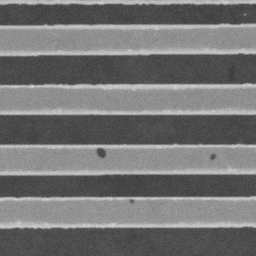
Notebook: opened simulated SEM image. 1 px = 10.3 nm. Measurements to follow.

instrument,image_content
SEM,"lines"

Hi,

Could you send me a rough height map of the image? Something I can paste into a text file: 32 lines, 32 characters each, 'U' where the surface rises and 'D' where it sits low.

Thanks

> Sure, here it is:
DDDDDDDDDDDUDDDDDDDDDDDDDDDDDDDD
DDDDDDDDDDDDDDDDDDDDDDDDDDDDDDDD
DDDDDDDDDDDDDDDDDDDDDDDDDDDDDDDD
UUUUUUUUUUUUUUUUUUUUUUUUUUUUUUUU
UUUUUUUUUUUUUUUUUUUUUUUUUUUUUUUU
UUUUUUUUUUUUUUUUUUUUUUUUUUUUUUUU
UUUUUUUUUUUUUUUUUUUUUUUUUUUUUUUU
DDDDDDDDDDDDDDDDDDDDDDDDDDDDDDDD
DDDDDDDDDDDDDDDDDDDDDDDDDDDDDDDD
DDDDDDDDDDDDDDDDDDDDDDDDDDDDDDDD
DDDDDDDDDDDDDDDDDDDDDDDDDDDDDDDD
UUUUUUUUUUUUUUUUUUUUUUUUUUUUUUUU
UUUUUUUUUUUUUUUUUUUUUUUUUUUUUUUU
UUUUUUUUUUUUUUUUUUUUUUUUUUUUUUUU
DDDDDDDDDDDDDDDDDDDDDDDDDDDDDDDD
DDDDDDDDDDDDDDDDDDDDDDDDDDDDDDDD
DDDDDDDDDDDDDDDDDDDDDDDDDDDDDDDD
DDDDDDDDDDDDDDDDDDDDDDDDDDDDDDDD
UUUUUUUUUUUUUUUUUUUUUUUUUUUUUUUU
UUUUUUUUUUUUUUUUUUUUUUUUUUUUUUUU
UUUUUUUUUUUUUUUUUUUUUUUUUUUUUUUU
UUUUUUUUUUUUUUUUUUUUUUUUUUUUUUUU
DDDDDDDDDDDDDDDDDDDDDDDDDDDDDDDD
DDDDDDDDDDDDDDDDDDDDDDDDDDDDDDDD
DDDDDDDDDDDDDDDDDDDDDDDDDDDDDDDD
UUUUUUUUUUUUUUUUUUUUUUUUUUUUUUUU
UUUUUUUUUUUUUUUUUUUUUUUUUUUUUUUU
UUUUUUUUUUUUUUUUUUUUUUUUUUUUUUUU
DDDDDDDDDDDDDDDDDDDDDDDDDDDDDDDD
DDDDDDDDDDDDDDDDDDDDDDDDDDDDDDDD
DDDDDDDDDDDDDDDDDDDDDDDDDDDDDDDD
DDDDDDDDDDDDDDDDDDDDDDDDDDDDDDDD